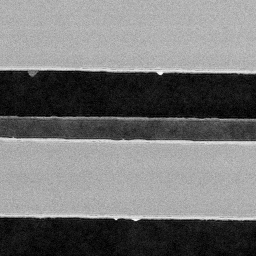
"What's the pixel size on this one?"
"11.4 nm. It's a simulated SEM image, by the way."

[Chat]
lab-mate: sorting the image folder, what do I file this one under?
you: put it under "lines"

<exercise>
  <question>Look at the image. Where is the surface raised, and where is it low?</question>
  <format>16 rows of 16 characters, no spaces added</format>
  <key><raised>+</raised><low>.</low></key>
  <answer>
++++++++++++++++
++++++++++++++++
++++++++++++++++
++++++++++++++++
..........+..+++
................
................
++++++++++++++..
++++++++++++++++
++++++++++++++++
++++++++++++++++
++++++++++++++++
++++++++++++++++
..++++++++++++++
................
................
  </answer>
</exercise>